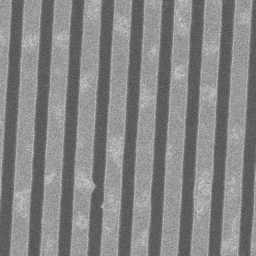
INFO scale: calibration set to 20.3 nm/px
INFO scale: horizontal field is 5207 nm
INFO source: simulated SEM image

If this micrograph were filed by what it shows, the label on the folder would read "parallel lines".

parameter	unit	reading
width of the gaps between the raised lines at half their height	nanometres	239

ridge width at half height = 383 nm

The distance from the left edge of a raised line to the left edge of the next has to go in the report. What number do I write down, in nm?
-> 611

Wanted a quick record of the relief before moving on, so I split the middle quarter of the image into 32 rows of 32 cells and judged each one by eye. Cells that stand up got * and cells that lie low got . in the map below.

*...*****...****...*****...****.
*...*****...****...*****...****.
*...*****..*****...****....****.
*...*****..*****...****....****.
*...****...*****...****....****.
*...****...*****...****...*****.
*...****...*****...****...*****.
*...****...*****...****...*****.
*...****...*****...****...*****.
*...****...*****...****...*****.
....****...*****...****...*****.
....****...*****...****...*****.
...*****...****....****...*****.
...*****...****....****...*****.
...*****...****...*****...****..
...*****...****...*****...****..
...*****...****...*****...****..
...*****...****...*****...****..
...*****...****...*****...****..
...****....****...*****...****..
...****...*****...****....****..
...****...*****...****....****..
...****...*****...*****..*****..
...****...*****...*****..*****..
...****...*****...****...*****..
...****...*****...****...*****..
...****...*****...****...*****..
...****...*****...****...*****..
...****...*****...****...*****..
...****...*****..*****...*****..
..******..****....****...*****..
..*****...****....****...*****..